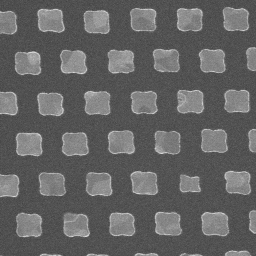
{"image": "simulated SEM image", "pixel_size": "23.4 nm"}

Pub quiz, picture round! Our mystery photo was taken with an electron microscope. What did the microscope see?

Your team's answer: a regular array of raised bodies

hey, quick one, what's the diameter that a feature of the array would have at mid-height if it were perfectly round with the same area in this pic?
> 600 nanometers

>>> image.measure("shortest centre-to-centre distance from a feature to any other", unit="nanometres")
1070